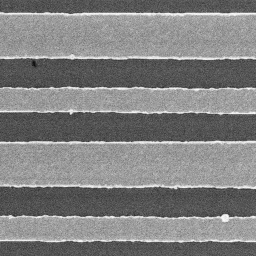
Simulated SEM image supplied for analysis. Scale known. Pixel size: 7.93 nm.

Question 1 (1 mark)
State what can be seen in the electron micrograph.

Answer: lines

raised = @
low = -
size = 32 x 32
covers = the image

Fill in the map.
--------------------------------
--------------------------------
@@@@@@@@@@@@@@@@@@@@@@@@@@@@@@@@
@@@@@@@@@@@@@@@@@@@@@@@@@@@@@@@@
@@@@@@@@@@@@@@@@@@@@@@@@@@@@@@@@
@@@@@@@@@@@@@@@@@@@@@@@@@@@@@@@@
@@@@@@@@@@@@@@@@@@@@@@@@@@@@@@@@
--------------------------------
--------------------------------
--------------------------------
--------------------------------
@@@@@@@@@@@@@@@@@@@@@@@@@@@@@@@@
@@@@@@@@@@@@@@@@@@@@@@@@@@@@@@@@
@@@@@@@@@@@@@@@@@@@@@@@@@@@@@@@@
--------------------------------
--------------------------------
--------------------------------
--------------------------------
@@@@@@@@@@@@@@@@@@@@@@@@@@@@@@@@
@@@@@@@@@@@@@@@@@@@@@@@@@@@@@@@@
@@@@@@@@@@@@@@@@@@@@@@@@@@@@@@@@
@@@@@@@@@@@@@@@@@@@@@@@@@@@@@@@@
@@@@@@@@@@@@@@@@@@@@@@@@@@@@@@@@
--------------------------------
--------------------------------
--------------------------------
--------------------------------
@@@@@@@@@@@@@@@@@@@@@@@@@@@@@@@@
@@@@@@@@@@@@@@@@@@@@@@@@@@@@@@@@
@@@@@@@@@@@@@@@@@@@@@@@@@@@@@@@@
--------------------------------
--------------------------------